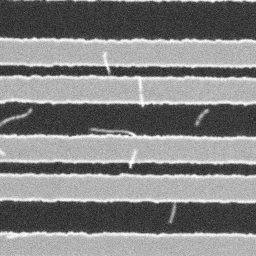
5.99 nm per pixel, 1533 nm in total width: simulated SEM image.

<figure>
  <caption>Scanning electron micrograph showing lines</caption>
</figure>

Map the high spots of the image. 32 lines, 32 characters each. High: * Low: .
................................
................................
................................
................................
................................
********************************
********************************
********************************
................................
.**.*.***..*....................
********************************
********************************
********************************
................................
................................
................................
................................
********************************
********************************
********************************
................................
................................
********************************
********************************
********************************
................................
................................
................................
................................
********************************
********************************
********************************